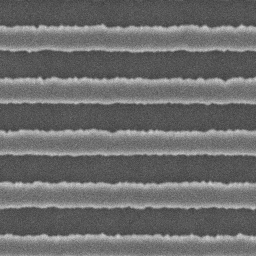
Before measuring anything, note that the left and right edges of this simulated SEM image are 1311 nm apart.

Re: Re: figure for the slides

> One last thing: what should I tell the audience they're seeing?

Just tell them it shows lines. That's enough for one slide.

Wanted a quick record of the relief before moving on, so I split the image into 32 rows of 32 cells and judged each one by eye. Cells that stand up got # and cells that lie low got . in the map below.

................................
................................
................................
################################
################################
################################
................................
................................
................................
................................
################################
################################
################################
................................
................................
................................
################################
################################
################################
................................
................................
................................
................................
################################
################################
################################
................................
................................
................................
##.###..#######.######.##..####.
################################
################################